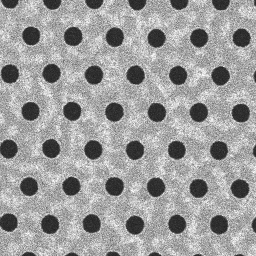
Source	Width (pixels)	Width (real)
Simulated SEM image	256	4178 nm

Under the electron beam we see a regular array of holes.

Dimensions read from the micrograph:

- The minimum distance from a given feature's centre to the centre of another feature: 683 nm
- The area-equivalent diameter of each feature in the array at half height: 310 nm